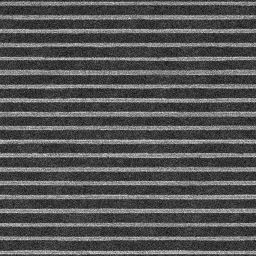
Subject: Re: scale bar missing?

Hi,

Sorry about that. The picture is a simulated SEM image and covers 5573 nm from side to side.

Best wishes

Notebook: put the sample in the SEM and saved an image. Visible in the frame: parallel lines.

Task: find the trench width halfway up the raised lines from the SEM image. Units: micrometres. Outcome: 0.229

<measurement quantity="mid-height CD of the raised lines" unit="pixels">3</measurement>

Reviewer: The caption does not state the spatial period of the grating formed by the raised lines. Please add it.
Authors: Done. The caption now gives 13.8 pixels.